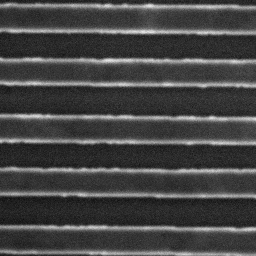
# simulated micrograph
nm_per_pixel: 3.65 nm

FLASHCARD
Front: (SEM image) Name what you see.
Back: lines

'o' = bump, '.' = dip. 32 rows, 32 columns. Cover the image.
oo..o...........................
oooooooooooooooooooooooooooooooo
oooooooooooooooooooooooooooooooo
oooooooooooooooooooooooooooooooo
................................
................................
................................
oooooooooooo.ooooooooo.ooo......
oooooooooooooooooooooooooooooooo
oooooooooooooooooooooooooooooooo
oooooooooooooooooooooooooooooooo
................................
................................
................................
oooooo..........................
oooooooooooooooooooooooooooooooo
oooooooooooooooooooooooooooooooo
oooooooooooooooooooooooooooooooo
................................
................................
................................
oooooooooooooooooooooooooooooooo
oooooooooooooooooooooooooooooooo
oooooooooooooooooooooooooooooooo
...................ooooooooooooo
................................
................................
................................
oooooooooooooooooooooo..........
oooooooooooooooooooooooooooooooo
oooooooooooooooooooooooooooooooo
oooooooooooooooooooooooooooooooo